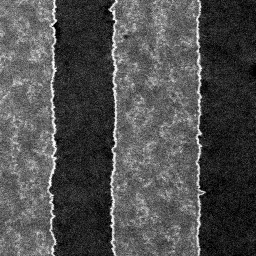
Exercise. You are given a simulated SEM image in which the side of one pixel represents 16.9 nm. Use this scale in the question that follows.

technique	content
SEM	one or a few lines or trenches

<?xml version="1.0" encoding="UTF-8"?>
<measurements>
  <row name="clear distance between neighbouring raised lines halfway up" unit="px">60.4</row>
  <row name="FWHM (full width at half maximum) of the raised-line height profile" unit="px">85.6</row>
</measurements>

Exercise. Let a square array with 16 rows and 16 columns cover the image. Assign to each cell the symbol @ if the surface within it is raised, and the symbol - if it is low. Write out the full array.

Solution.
@@@----@@@@@----
@@@----@@@@@----
@@@----@@@@@----
@@@----@@@@@----
@@@----@@@@@----
@@@----@@@@@----
@@@----@@@@@----
@@@----@@@@@----
@@@----@@@@@----
@@@----@@@@@----
@@@----@@@@@----
@@@----@@@@@----
@@@----@@@@@@---
@@@----@@@@@----
@@@----@@@@@----
@@@----@@@@@----